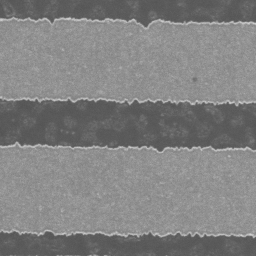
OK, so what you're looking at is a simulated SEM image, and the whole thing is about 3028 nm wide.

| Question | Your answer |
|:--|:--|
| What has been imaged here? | one or a few lines or trenches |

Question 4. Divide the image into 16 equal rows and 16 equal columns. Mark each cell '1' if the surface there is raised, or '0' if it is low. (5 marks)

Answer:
0000000000000000
1111111111111111
1111111111111111
1111111111111111
1111111111111111
1111111111111111
0000000000000000
0000000000000000
0000000000000000
1111111111111111
1111111111111111
1111111111111111
1111111111111111
1111111111111111
0111111111111111
0000000000000000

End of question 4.